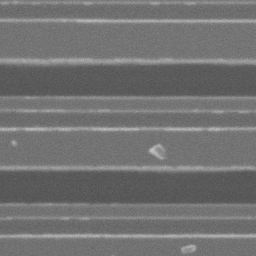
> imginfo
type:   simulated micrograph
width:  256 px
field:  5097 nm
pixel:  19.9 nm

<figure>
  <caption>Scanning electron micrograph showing lines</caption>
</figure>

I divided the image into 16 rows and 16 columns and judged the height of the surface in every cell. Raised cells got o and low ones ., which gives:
oooooooooooooooo
oooooooooooooooo
oooooooooooooooo
oooooooooooooooo
................
................
oooooooooooooooo
oooooooooooooooo
oooooooooooooooo
oooooooooooooooo
................
................
................
oooooooooooooooo
oooooooooooooooo
oooooooooooooooo